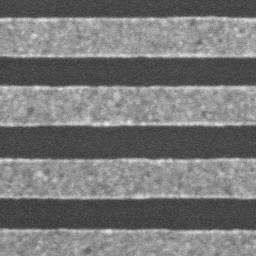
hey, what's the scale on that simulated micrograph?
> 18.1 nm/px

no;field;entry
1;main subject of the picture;lines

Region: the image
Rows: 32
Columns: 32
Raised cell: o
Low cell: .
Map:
................................
................................
oooooooooooooooooooooooooooooooo
oooooooooooooooooooooooooooooooo
oooooooooooooooooooooooooooooooo
oooooooooooooooooooooooooooooooo
oooooooooooooooooooooooooooooooo
................................
................................
................................
................................
oooooooooooooooooooooooooooooooo
oooooooooooooooooooooooooooooooo
oooooooooooooooooooooooooooooooo
oooooooooooooooooooooooooooooooo
oooooooooooooooooooooooooooooooo
................................
................................
................................
................................
oooooooooooooooooooooooooooooooo
oooooooooooooooooooooooooooooooo
oooooooooooooooooooooooooooooooo
oooooooooooooooooooooooooooooooo
oooooooooooooooooooooooooooooooo
................................
................................
................................
................................
oooooooooooooooooooooooooooooooo
oooooooooooooooooooooooooooooooo
oooooooooooooooooooooooooooooooo